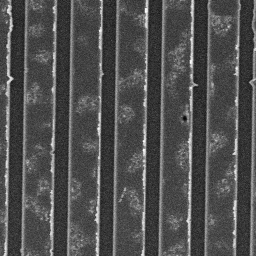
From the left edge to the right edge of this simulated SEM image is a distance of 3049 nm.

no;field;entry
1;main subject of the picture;parallel lines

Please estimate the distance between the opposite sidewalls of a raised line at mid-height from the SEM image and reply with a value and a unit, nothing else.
366 nanometres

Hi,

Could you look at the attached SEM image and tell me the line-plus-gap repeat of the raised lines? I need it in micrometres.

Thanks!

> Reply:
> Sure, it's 0.545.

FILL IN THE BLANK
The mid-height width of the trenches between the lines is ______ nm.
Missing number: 177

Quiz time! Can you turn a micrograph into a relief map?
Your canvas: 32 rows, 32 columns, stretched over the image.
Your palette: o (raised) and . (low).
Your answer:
o..oooo..oooo..ooo..oooo..oooo..
o..oooo..oooo..ooo..oooo..oooo..
oo.oooo..oooo..ooo..oooo..oooo..
oo.oooo..oooo..ooo..oooo..oooo..
o..oooo..oooo..ooo..oooo..oooo..
o..oooo..oooo..ooo..oooo..oooo..
o..oooo..oooo..ooo..oooo..oooo..
o..oooo..oooo..ooo..oooo..oooo..
o..oooo..oooo..ooo..oooo..oooo..
o..oooo..oooo..ooo..oooo..oooo..
o..oooo..oooo..ooo..oooo..oooo..
o..oooo..oooo..ooo..oooo..oooo..
o..oooo..oooo..ooo..oooo..oooo..
o..oooo..oooo.oooo..oooo..oooo..
o..oooo..oooo.oooo..oooo..oooo..
o..oooo..ooo..oooo..oooo..oooo..
o..oooo..ooo..oooo..oooo..oooo..
o..oooo..ooo..oooo..oooo..oooo..
o..oooo..ooo..oooo..oooo..oooo..
o..oooo..ooo..oooo..oooo..oooo..
o..oooo..ooo..oooo..oooo..oooo..
o..oooo..ooo..oooo..oooo..oooo..
o..oooo..ooo..oooo..oooo..ooo...
o..oooo..ooo..oooo..oooo..ooo...
o..oooo..ooo..oooo..oooo..ooo...
o..oooo..ooo..oooo..oooo..ooo...
o..oooo..ooo..oooo..oooo..ooo...
o..oooo..ooo..oooo..oooo..ooo...
o..oooo..ooo..oooo..oooo..ooo..o
o..oooo..ooo..oooo..oooo..ooo..o
o..oooo..ooo..oooo..oooo..ooo..o
o..oooo..ooo..oooo..oooo..ooo..o